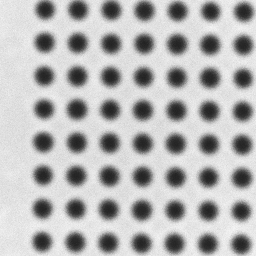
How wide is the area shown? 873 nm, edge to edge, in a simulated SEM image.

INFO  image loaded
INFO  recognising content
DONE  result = a regular array of holes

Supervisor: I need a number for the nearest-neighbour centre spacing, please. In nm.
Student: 112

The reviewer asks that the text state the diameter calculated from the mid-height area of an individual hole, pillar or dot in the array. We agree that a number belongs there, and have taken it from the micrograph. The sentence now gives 67.2 nanometres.